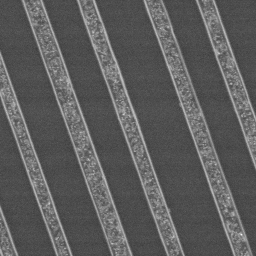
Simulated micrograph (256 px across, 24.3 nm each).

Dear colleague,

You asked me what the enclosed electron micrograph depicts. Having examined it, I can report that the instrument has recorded parallel lines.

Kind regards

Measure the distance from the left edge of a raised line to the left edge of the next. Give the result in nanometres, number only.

1350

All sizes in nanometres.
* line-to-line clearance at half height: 914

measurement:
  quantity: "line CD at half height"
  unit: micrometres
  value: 0.387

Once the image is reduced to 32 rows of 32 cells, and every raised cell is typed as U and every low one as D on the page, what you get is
DDDUUDDDDDUUDDDDDDUUDDDDDUUDDDDD
DDDUUUDDDDUUDDDDDDDUUDDDDUUDDDDD
DDDDUUDDDDDUUDDDDDDUUDDDDUUUDDDD
DDDDUUDDDDDUUDDDDDDUUDDDDDUUDDDD
DDDDUUUDDDDUUDDDDDDDUUDDDDUUDDDD
DDDDDUUDDDDDUUDDDDDDUUDDDDDUUDDD
DDDDDUUDDDDDUUDDDDDDUUUDDDDUUDDD
DDDDDUUUDDDDUUDDDDDDDUUDDDDUUDDD
UDDDDDUUDDDDDUUDDDDDDUUDDDDDUUDD
UDDDDDUUUDDDDUUDDDDDDUUUDDDDUUDD
UDDDDDDUUDDDDUUDDDDDDDUUDDDDUUDD
UUDDDDDUUDDDDDUUDDDDDDUUDDDDDUUD
UUDDDDDUUUDDDDUUDDDDDDDUUDDDDUUD
DUDDDDDDUUDDDDUUUDDDDDDUUDDDDUUD
DUUDDDDDUUDDDDDUUDDDDDDUUDDDDDUU
DUUDDDDDUUUDDDDUUDDDDDDDUUDDDDUU
DDUDDDDDDUUDDDDUUUDDDDDDUUDDDDUU
DDUUDDDDDUUDDDDDUUDDDDDDUUDDDDDU
DDUUDDDDDUUUDDDDUUDDDDDDDUUDDDDU
DDDUDDDDDDUUDDDDDUUDDDDDDUUDDDDU
DDDUUDDDDDUUDDDDDUUDDDDDDUUDDDDD
DDDUUDDDDDUUUDDDDUUDDDDDDDUUDDDD
DDDDUUDDDDDUUDDDDDUUDDDDDDUUDDDD
DDDDUUDDDDDUUDDDDDUUDDDDDDUUUDDD
DDDDDUDDDDDUUUDDDDUUDDDDDDDUUDDD
DDDDDUUDDDDDUUDDDDDUUDDDDDDUUDDD
DDDDDUUDDDDDUUUDDDDUUDDDDDDUUUDD
UDDDDDUDDDDDDUUDDDDUUDDDDDDDUUDD
UDDDDDUUDDDDDUUDDDDDUUDDDDDDUUDD
UDDDDDUUDDDDDUUUDDDDUUDDDDDDUUUD
UUDDDDDUDDDDDDUUDDDDUUDDDDDDDUUD
UUDDDDDUUDDDDDUUDDDDDUUDDDDDDUUD